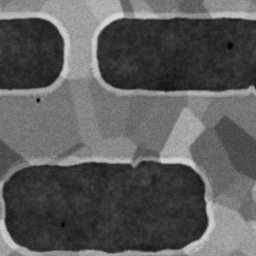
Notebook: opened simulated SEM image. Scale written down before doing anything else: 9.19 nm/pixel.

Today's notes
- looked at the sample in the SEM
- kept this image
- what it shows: one or a few lines or trenches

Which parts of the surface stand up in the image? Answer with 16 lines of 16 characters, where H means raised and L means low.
HHHHHHHHHHHHHHHH
LLLHHHHLLLLLLLLL
LLLLHHLLLLLLLLLL
LLLLHHLLLLLLLLLL
LLLLHHLLLLLLLLLL
LLLHHHHLLLLLLLLL
HHHHHHHHHHHHHHHH
HHHHHHHHHHHHHHHH
HHHHHHHHHHHHHHHH
HHHHHHHHHHHHHHHH
HLLLLLLLLLLLHHHH
LLLLLLLLLLLLLHHH
LLLLLLLLLLLLLHHH
LLLLLLLLLLLLLHHH
LLLLLLLLLLLLLHHH
HLLLLLLLLLLLHHHH